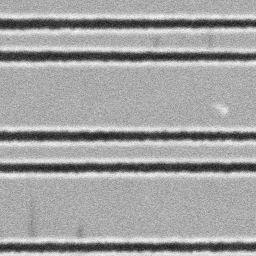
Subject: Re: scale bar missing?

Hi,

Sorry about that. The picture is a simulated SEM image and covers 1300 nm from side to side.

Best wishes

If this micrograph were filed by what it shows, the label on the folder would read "lines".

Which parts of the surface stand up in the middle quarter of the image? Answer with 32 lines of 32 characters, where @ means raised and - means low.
@@@@@@@@@@@@@@@@@@@@@@@@@@@@@@@@
@@@@@@@@@@@@@@@@@@@@@@@@@@@@@@@@
@@@@@@@@@@@@@@@@@@@@@@@@@@@@@@@@
@@@@@@@@@@@@@@@@@@@@@@@@@@@@@@@@
@@@@@@@@@@@@@@@@@@@@@@@@@@@@@@@@
@@@@@@@@@@@@@@@@@@@@@@@@@@@@@@@@
@@@@@@@@@@@@@@@@@@@@@@@@@@@@@@@@
@@@@@@@@@@@@@@@@@@@@@@@@@@@@@@@@
@@@@@@@@@@@@@@@@@@@@@@@@@@@@@@@@
@@@@@@@@@@@@@@@@@@@@@@@@@@@@@@@@
@@@@@@@@@@@@@@@@@@@@@@@@@@@@@@@@
@@@@@@@@@@@@@@@@@@@@@@@@@@@@@@@@
@@@@@@@@@@@@@@@@@@@@@@@@@@@@@@@@
@@@@@@@@@@@@@@@@@@@@@@@@@@@@@@@@
@@@@@@@@@@@@@@@@@@@@@@@@@@@@@@@@
@@@@@@@@@@@@@@@@@@@@@@@@@@@@@@@@
@@@@@@@@@@@@@@@@@@@@@@@@@@@@@@@@
--------------------------------
--------------------------------
@---@@-@@@-@@@@@@@@@@@@@@@@@@@@@
@@@@@@@@@@@@@@@@@@@@@@@@@@@@@@@@
@@@@@@@@@@@@@@@@@@@@@@@@@@@@@@@@
@@@@@@@@@@@@@@@@@@@@@@@@@@@@@@@@
@@@@@@@@@@@@@@@@@@@@@@@@@@@@@@@@
@@@@@@--@@@@@---@@@@--@--@------
--------------------------------
--------------------------------
@@@@@@@@@@@@@@@@@@@@@@@@@@@@@@@@
@@@@@@@@@@@@@@@@@@@@@@@@@@@@@@@@
@@@@@@@@@@@@@@@@@@@@@@@@@@@@@@@@
@@@@@@@@@@@@@@@@@@@@@@@@@@@@@@@@
@@@@@@@@@@@@@@@@@@@@@@@@@@@@@@@@